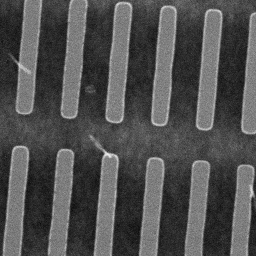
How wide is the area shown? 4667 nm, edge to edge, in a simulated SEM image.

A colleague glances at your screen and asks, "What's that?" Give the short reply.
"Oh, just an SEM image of groups of lines, slits or small figures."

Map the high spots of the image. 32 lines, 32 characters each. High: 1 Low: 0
00011000011000010000000000000000
00011000011000110000110000100000
00011000011000110000110000110001
00011000111000110000110000110001
00011000111000110000110001110001
00011000110000110000110001100001
00011000110000110000110001100001
00111000110000110000110001100001
00110000110000110000100001100001
00110000110000110001100001100001
00110000110000110001100001100001
00110000110001110001100001100001
00110000110001100001100001100011
00110000110001100001100001100011
00000000100001100001100001100011
00000000000000000001000001100011
00000000000000000000000000000001
00000000000000000000000000000000
00100000000000000000000000000000
00100001100001000000000000000000
01100001100001100011000011000000
01100001100001100011000011000011
01100001100001100011000011000011
01100001100011000011000011000011
01100001100011000011000011000011
01100001100011000011000011000110
01100001100011000011000011000110
01100011100011000011000011000110
01100011000011000011000111000110
01100011000011000011000110000110
01100011000011000011000110000110
01100011000011000111000110000110